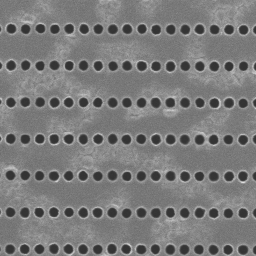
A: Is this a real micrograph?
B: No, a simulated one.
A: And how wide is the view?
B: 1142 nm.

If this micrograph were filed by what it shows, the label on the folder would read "a regular array of holes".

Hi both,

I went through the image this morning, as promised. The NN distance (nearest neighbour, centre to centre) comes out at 64.1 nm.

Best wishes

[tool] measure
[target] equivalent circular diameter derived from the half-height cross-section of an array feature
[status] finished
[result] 41.2 nm